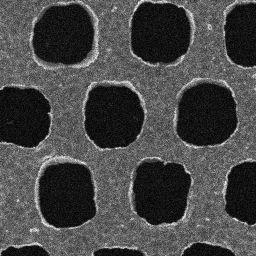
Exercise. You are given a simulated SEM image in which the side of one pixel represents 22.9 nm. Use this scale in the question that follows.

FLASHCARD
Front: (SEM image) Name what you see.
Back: holes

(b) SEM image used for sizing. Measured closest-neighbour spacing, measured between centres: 2070 nm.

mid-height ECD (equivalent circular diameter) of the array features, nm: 1460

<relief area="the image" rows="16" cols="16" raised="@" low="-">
@@@--@@@@--@@@@-
@@----@@----@@--
@@----@@----@@--
@@----@@@--@@@--
@@@@@@@@@@@@@@@@
-@@@@@--@@@@--@@
---@@----@@----@
---@@----@@----@
---@@@---@@---@@
@@@@@@@@@@@@@@@@
@@@--@@@@--@@@@-
@@----@@----@@--
@@----@@----@@--
@@@---@@@--@@@--
@@@@@@@@@@@@@@@@
@--@@@@@@@@@--@@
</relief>